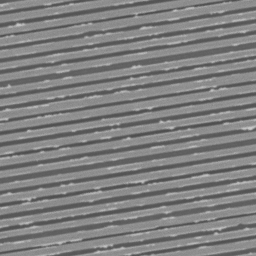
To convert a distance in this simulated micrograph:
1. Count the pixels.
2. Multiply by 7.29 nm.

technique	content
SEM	parallel lines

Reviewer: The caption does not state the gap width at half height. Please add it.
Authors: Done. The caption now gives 4.2 pixels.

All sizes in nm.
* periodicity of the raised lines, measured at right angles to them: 86.4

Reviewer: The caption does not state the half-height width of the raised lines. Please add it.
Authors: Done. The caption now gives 55.8 nm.